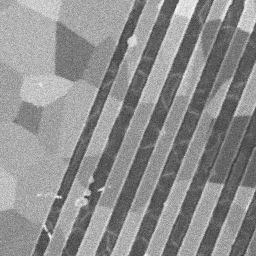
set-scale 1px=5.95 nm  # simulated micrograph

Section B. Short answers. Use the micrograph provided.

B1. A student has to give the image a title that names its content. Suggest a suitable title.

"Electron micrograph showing parallel lines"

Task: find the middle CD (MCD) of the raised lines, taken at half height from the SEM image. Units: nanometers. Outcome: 93.1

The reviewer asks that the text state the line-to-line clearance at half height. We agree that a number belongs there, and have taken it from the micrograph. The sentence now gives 93.1 nanometres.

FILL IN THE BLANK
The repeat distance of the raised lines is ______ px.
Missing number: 31